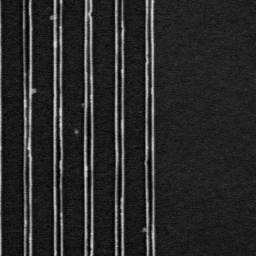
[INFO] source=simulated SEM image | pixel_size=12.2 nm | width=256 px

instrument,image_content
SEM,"parallel lines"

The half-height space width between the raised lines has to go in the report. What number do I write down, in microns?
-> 0.284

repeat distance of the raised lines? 373 nm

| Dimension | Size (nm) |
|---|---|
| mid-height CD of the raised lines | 83.9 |